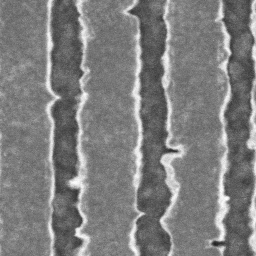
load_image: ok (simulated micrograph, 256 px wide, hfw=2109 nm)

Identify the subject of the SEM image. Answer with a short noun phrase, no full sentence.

one or a few lines or trenches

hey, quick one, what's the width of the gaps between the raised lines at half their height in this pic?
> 244 nm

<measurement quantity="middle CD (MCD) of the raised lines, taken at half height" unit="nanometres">462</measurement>